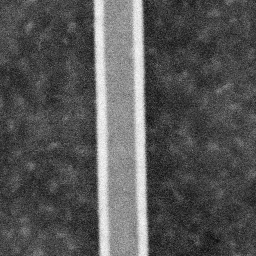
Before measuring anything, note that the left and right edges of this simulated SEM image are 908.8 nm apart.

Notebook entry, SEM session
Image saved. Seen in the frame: one or a few lines or trenches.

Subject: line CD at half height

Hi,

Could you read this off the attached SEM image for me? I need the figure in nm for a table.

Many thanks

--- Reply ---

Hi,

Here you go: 138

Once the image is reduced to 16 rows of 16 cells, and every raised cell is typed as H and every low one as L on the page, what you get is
LLLLLLHHHLLLLLLL
LLLLLLHHHLLLLLLL
LLLLLLHHHLLLLLLL
LLLLLLHHHLLLLLLL
LLLLLLHHHLLLLLLL
LLLLLLHHHLLLLLLL
LLLLLLHHHLLLLLLL
LLLLLLHHHLLLLLLL
LLLLLLHHHLLLLLLL
LLLLLLHHHLLLLLLL
LLLLLLHHHLLLLLLL
LLLLLLHHHLLLLLLL
LLLLLLHHHLLLLLLL
LLLLLLHHHLLLLLLL
LLLLLLHHHLLLLLLL
LLLLLLLHHLLLLLLL